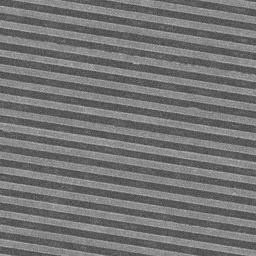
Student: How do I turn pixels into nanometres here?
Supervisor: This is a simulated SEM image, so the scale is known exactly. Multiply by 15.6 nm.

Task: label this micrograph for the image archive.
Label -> parallel lines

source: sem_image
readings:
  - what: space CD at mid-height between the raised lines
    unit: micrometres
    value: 0.118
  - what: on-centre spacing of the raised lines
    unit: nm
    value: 225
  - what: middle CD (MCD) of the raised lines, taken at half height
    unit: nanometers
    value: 104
